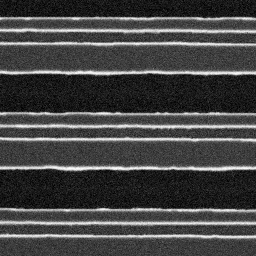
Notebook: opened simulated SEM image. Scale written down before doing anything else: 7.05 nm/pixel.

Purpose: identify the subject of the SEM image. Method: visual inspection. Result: lines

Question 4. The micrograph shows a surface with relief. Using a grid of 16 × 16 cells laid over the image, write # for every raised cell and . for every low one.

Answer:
................
################
################
################
################
................
................
################
################
################
....############
................
................
################
################
################